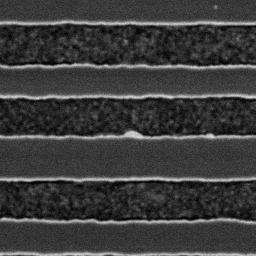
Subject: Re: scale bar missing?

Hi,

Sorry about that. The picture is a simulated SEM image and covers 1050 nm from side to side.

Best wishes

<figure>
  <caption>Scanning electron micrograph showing lines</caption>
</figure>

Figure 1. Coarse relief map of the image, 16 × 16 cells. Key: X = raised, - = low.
XXXXXXXXXXXXXXXX
-XX--XXXXXXXX-XX
----------------
----------------
XXXXXXXXXXXXXXXX
XXXXXXXXXXXXXXXX
----------------
----------------
------------X---
XXXXXXXXXXXXXXXX
XXXXXXXXXXXXXXXX
----------------
----------------
----------------
XXXXXXXXXXXXXXXX
XXXXXXXXXXXXXXXX